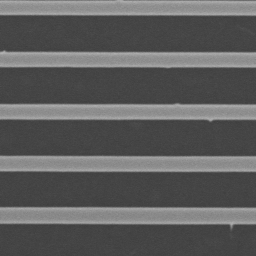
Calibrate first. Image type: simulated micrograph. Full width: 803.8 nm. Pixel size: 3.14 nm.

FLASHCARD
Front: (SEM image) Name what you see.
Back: parallel lines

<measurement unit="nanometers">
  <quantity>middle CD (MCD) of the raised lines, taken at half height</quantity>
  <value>47.6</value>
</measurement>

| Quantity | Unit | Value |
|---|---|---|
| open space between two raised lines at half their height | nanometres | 116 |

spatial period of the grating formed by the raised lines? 163 nanometers